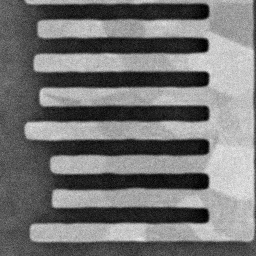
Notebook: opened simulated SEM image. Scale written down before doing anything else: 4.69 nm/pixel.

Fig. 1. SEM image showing groups of lines, slits or small figures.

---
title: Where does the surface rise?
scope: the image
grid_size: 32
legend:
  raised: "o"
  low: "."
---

..........................oooooo
..........................oooooo
................o........ooooooo
.....ooooooooooooooooooooooooooo
.....ooooooooooooooooooooooooooo
..........................oooooo
..........................oooooo
....oooooooooooooooooooooooooooo
....oooooooooooooooooooooooooooo
..........................oooooo
..........................oooooo
.....ooooooooooooooooooooooooooo
.....ooooooooooooooooooooooooooo
..........................oooooo
..........................oooooo
...ooooooooooooooooooooooooooooo
...ooooooooooooooooooooooooooooo
..........................oooooo
..........................oooooo
.......oooooo..ooooooooooooooooo
......oooooooooooooooooooooooooo
.......ooooooooooooooooooooooooo
..........................oooooo
..........................oooooo
.......ooooooooooooooooooooooooo
.......ooooooooooooooooooooooooo
..........................oooooo
..........................oooooo
....oooooooooooooooooooooooooooo
....oooooooooooooooooooooooooooo
................................
................................